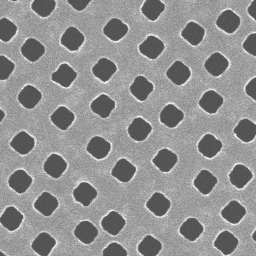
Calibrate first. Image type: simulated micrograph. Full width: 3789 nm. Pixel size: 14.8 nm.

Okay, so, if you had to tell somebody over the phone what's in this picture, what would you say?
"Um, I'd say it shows a regular array of holes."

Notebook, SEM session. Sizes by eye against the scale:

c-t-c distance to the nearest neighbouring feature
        0.553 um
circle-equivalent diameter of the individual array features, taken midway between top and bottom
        336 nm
